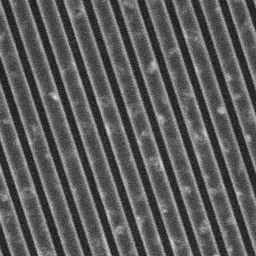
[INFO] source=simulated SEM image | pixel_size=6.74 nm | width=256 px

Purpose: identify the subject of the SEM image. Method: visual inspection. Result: parallel lines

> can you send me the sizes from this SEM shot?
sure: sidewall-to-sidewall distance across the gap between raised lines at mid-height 58.5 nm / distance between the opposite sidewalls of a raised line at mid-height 118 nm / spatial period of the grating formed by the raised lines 174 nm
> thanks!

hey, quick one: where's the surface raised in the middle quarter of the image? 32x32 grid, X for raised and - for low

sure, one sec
XXX--XXXXX--XXXXX--XXXXX--XXXX--
XXX---XXXX---XXXX--XXXXX--XXXXX-
XXXX--XXXX---XXXX---XXXX--XXXXX-
XXXX--XXXXX--XXXXX--XXXXX--XXXX-
XXXX---XXXX---XXXX--XXXXX--XXXX-
XXXXX--XXXX---XXXX---XXXX--XXXXX
XXXXX--XXXXX--XXXXX--XXXX---XXXX
-XXXX---XXXX---XXXX--XXXXX--XXXX
-XXXXX--XXXXX--XXXX---XXXX--XXXX
-XXXXX--XXXXX--XXXXX--XXXX---XXX
--XXXX---XXXX---XXXX--XXXXX--XXX
--XXXXX--XXXXX--XXXX---XXXX--XXX
--XXXXX--XXXXX--XXXXX--XXXX---XX
---XXXX---XXXX---XXXX--XXXXX--XX
X--XXXXX--XXXX---XXXX---XXXX--XX
X--XXXXX--XXXXX--XXXXX--XXXX---X
X---XXXX---XXXX---XXXX--XXXXX--X
XX--XXXXX--XXXX---XXXX--XXXXX--X
XX--XXXXX--XXXXX--XXXXX--XXXX--X
XX---XXXX---XXXX--XXXXX--XXXXX--
XXX--XXXXX--XXXXX--XXXX--XXXXX--
XXX--XXXXX--XXXXX--XXXX---XXXX--
XXX---XXXX---XXXX--XXXXX--XXXXX-
XXXX--XXXXX--XXXX---XXXX--XXXXX-
XXXX--XXXXX--XXXXX--XXXX---XXXX-
XXXX---XXXX---XXXX--XXXXX--XXXXX
XXXXX--XXXXX--XXXX---XXXX--XXXXX
XXXXX--XXXXX--XXXXX--XXXX---XXXX
-XXXX---XXXX---XXXX--XXXXX--XXXX
-XXXXX--XXXXX--XXXX---XXXX--XXXX
-XXXXX--XXXXX--XXXXX--XXXX---XXX
--XXXX---XXXX---XXXX--XXXXX--XXX